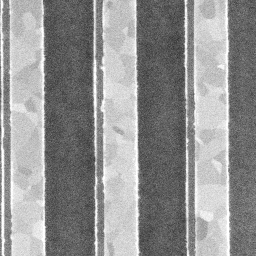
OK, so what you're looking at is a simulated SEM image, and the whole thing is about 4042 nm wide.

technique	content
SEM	lines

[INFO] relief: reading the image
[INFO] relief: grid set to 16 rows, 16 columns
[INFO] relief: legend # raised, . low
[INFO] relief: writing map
###...##....##..
###...##....##..
###...##....##..
###...##....##..
###...##....##..
###...##....##..
###...##....##..
###...##....##..
###...##....##..
###...###...##..
###...###...##..
###...###...##..
###...###...##..
###...###...##..
###...###...##..
###...###...##..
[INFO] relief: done